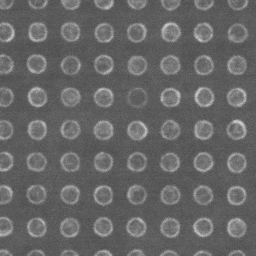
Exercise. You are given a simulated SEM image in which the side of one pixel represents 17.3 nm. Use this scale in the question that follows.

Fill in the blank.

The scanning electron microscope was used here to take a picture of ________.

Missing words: a regular array of raised bodies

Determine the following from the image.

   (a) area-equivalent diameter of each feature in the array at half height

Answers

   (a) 308 nanometers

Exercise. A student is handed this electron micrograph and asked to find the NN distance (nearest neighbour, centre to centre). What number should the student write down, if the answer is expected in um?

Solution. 0.557